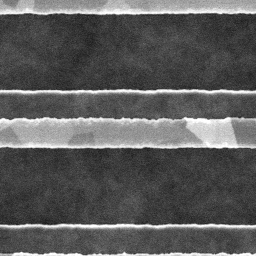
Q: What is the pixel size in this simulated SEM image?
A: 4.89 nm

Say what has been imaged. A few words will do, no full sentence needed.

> lines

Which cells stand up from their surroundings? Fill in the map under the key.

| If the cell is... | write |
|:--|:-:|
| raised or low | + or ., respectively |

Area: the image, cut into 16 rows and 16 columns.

++++++++++++++++
................
................
................
................
................
++++++++++++++++
++++++++++++++++
++++++++++++++++
................
................
................
................
................
++++++++++++++++
++++++++++++++++